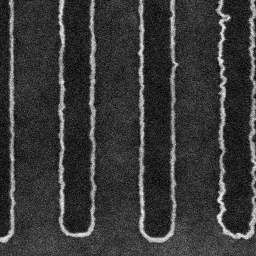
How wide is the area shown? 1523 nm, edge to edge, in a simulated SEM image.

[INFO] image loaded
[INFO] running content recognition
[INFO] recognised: one or a few lines or trenches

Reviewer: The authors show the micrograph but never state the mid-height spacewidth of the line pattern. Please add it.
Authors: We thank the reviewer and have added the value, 0.282 um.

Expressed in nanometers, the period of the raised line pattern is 477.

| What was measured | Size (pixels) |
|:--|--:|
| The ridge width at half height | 33.3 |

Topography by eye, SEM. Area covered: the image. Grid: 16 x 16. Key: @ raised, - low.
@---@@---@@---@@
@---@@---@@---@@
@---@@---@@---@@
@---@@---@@---@@
@---@@---@@---@@
@---@@---@@---@@
@---@@---@@---@@
@---@@---@@---@@
@---@@---@@---@@
@---@@---@@---@@
@---@@---@@---@@
@---@@---@@---@@
@---@@---@@---@@
@---@@---@@---@@
@---@----@@---@@
----------------